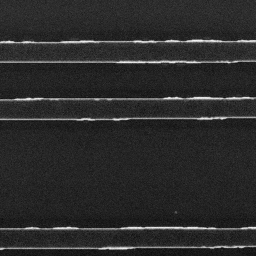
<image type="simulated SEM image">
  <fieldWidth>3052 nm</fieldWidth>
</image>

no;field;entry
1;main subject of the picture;lines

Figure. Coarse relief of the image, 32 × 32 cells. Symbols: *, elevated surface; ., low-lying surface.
................................
................................
................................
................................
................................
********************************
********************************
********************************
................................
................................
................................
................................
...*****************************
********************************
********************************
................................
................................
................................
................................
................................
................................
................................
................................
................................
................................
................................
................................
................................
................................
********************************
********************************
................................